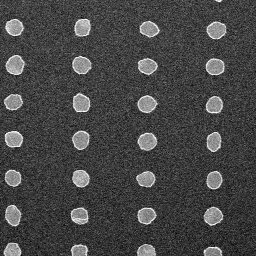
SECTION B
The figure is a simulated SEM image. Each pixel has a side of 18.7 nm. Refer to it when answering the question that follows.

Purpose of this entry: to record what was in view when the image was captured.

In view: a regular array of raised bodies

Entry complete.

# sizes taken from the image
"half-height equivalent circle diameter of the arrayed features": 0.307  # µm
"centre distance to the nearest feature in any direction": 0.691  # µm